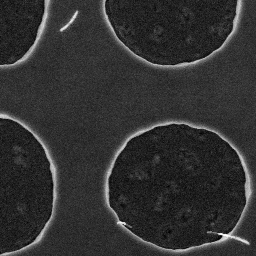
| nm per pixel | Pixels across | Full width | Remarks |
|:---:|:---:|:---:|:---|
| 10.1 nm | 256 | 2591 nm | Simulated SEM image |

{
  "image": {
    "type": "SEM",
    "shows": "holes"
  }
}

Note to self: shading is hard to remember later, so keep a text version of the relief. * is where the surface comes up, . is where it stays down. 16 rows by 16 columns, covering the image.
...****........*
...****........*
..******......**
..*******....***
****************
****************
****************
.***************
..*******.....**
...*****.......*
...****........*
...****........*
...****........*
...****........*
...*****......**
.*********..****